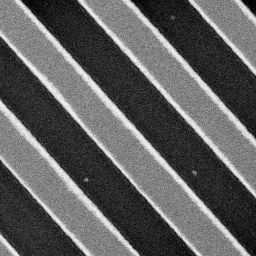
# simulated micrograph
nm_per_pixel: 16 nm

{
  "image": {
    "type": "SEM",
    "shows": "lines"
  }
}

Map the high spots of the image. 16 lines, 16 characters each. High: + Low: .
++...++++...+++.
+++...+++....+++
++++...+++....++
.+++....+++....+
..+++....+++....
...+++....+++...
....+++....+++..
+....+++....+++.
++....+++....+++
+++....+++...+++
.+++...++++...++
.++++...++++...+
..++++...+++....
...++++...+++...
....+++....+++..
+....+++....+++.